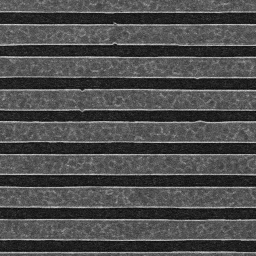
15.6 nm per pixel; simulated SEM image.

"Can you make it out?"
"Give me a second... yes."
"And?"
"parallel lines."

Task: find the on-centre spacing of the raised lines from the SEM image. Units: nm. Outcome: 508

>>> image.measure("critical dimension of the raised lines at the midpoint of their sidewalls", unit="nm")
318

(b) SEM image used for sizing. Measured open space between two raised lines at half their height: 12.7 pixels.